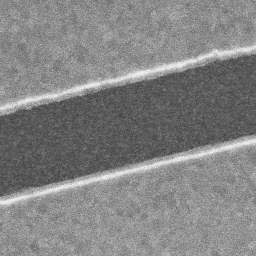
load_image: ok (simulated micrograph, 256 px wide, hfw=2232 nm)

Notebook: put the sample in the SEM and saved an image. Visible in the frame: one or a few lines or trenches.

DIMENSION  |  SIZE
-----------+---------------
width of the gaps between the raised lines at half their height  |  805 nanometers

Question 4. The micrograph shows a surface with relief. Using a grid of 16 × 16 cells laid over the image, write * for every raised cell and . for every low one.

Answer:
****************
****************
****************
*************...
*********.......
*****...........
*...............
................
................
.............***
.........*******
.....***********
.***************
****************
****************
****************